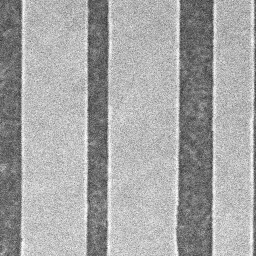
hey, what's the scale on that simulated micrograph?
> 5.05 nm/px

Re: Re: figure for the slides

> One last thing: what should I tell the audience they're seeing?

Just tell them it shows one or a few lines or trenches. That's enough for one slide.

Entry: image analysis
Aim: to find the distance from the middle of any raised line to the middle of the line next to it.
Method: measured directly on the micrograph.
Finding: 89.2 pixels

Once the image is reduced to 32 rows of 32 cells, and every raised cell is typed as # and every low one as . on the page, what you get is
...########...########.....#####
...########...########.....#####
...########...########.....#####
...########...########.....#####
...########...########.....#####
...########...########.....#####
...########...########.....#####
...########...########.....#####
...########...########.....#####
...########...########.....#####
...########...########.....#####
...########...########.....#####
...########...########.....#####
.#.########...########.....#####
...########...########.....#####
...########...########.....####.
...########...########.....#####
...########...########.....#####
...########...########.....#####
...########...########.....#####
...########...########.....#####
...########...########.....#####
...########...########.....#####
...########...########.....#####
...########...########.....#####
...########...########.....#####
...########...########.....####.
...########...########.....####.
...########...########.....####.
...########...########.....####.
...########...########.....####.
...########..#########.....####.